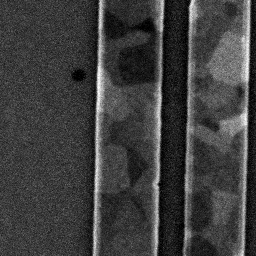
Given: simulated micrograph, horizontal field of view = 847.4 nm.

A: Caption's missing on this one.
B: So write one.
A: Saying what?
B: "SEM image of one or a few lines or trenches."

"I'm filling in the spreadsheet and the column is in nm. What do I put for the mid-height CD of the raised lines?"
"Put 200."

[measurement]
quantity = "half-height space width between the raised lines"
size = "92.7 nm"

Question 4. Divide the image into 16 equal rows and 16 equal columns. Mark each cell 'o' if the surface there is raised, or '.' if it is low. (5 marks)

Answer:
......oooo..oooo
......oooo..oooo
......oooo..oooo
......oooo..ooo.
......oooo..ooo.
......oooo..ooo.
......oooo..ooo.
......oooo..ooo.
......oooo..ooo.
......oooo..ooo.
......oooo..ooo.
......oooo..ooo.
......oooo..ooo.
......oooo..ooo.
......oooo..ooo.
......oooo..ooo.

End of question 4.